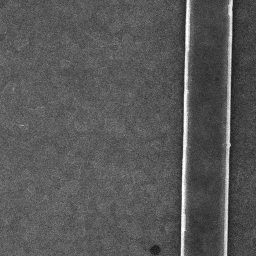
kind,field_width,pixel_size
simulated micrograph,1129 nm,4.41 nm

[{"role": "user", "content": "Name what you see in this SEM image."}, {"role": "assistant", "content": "one or a few lines or trenches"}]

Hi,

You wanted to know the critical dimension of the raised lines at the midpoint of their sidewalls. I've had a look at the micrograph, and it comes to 196 nm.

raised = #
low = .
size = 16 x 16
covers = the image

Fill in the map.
............##..
............##..
............##..
............##..
............##..
............##..
............##..
............##..
............##..
............##..
...........###..
...........###..
...........###..
...........###..
...........###..
...........###..